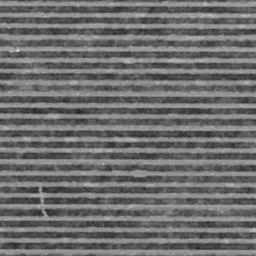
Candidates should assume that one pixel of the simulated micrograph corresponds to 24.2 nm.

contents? parallel lines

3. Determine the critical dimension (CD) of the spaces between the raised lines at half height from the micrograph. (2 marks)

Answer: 157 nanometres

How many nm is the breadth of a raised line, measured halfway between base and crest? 112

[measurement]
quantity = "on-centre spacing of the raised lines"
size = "272 nm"